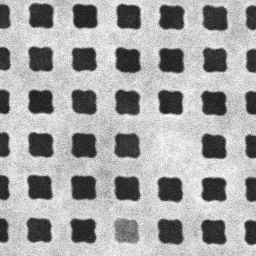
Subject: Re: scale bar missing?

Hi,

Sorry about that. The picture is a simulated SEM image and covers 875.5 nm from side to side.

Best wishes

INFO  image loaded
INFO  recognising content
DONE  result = a regular array of holes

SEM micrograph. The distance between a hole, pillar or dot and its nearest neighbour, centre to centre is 146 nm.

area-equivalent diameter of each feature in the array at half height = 88.8 nm